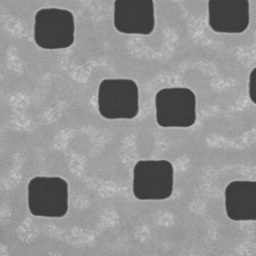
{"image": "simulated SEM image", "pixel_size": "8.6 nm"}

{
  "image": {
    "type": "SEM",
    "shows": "holes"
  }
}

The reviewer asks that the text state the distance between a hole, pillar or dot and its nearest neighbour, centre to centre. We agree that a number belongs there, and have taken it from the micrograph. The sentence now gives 0.651 micrometres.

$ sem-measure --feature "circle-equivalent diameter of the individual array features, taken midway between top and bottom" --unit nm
368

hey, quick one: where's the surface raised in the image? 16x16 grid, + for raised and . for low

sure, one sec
+++++++...+++...
++...++...+++..+
++...+++++++++++
++++++++++++++++
++++++++++++++++
++++++...+++++++
++++++...+..++++
++++++++++..++++
++++++++++++++++
++++++++++++++++
++++++++...+++++
++..++++...+++..
++..++++++++++..
+++.++++++++++..
++++++++++++++++
++++++++++++++++